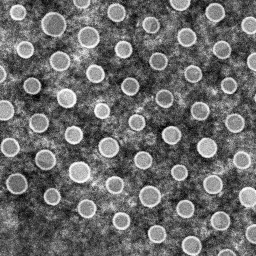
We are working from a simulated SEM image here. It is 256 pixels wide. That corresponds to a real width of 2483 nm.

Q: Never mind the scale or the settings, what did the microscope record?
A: a regular array of raised bodies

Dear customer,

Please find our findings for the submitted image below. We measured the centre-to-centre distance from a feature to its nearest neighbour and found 356 nm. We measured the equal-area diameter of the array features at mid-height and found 164 nm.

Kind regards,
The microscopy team